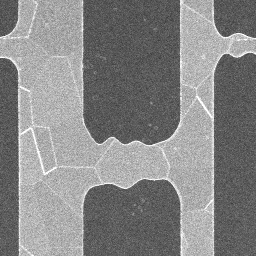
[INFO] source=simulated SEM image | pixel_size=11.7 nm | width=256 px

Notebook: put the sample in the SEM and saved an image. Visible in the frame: one or a few lines or trenches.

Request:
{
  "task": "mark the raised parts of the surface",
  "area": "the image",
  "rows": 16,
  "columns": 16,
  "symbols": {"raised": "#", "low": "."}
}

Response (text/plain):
.####......##...
.####......##...
#####......#####
#####......###..
.####......##...
.####......##...
.####......##...
.####......##...
.#####.....##...
.############...
.############...
.#######...##...
.####......##...
.####......##...
.####......##...
.####......##...